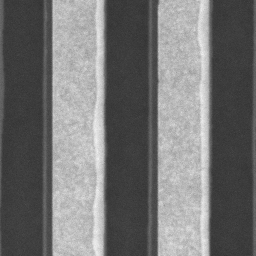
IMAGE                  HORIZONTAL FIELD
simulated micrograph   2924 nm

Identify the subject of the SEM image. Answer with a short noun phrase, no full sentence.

lines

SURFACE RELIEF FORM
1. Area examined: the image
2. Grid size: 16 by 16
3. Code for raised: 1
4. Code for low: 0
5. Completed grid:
0001110000111000
0001110000111000
0001110000111000
0001110000111000
0001110000111000
0001110000111000
0001110000111000
0001110000111000
0001110000111000
0001110000111000
0001110000111000
0001110000111000
0001110000111000
0001110000111000
0001110000111000
0001110000111000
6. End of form